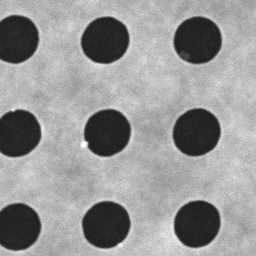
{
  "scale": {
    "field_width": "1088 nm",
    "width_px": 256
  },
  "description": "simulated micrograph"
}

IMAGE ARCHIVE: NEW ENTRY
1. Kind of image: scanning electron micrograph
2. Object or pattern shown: holes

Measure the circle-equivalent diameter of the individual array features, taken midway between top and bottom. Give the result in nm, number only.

201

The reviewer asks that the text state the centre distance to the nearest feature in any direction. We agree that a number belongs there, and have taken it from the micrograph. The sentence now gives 387 nm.